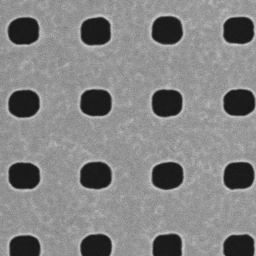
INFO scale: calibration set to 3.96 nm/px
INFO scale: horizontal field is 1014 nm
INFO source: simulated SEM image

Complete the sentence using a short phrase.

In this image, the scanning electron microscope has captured a regular array of holes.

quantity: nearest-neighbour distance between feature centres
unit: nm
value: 283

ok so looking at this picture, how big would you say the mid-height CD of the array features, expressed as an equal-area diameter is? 120 nm